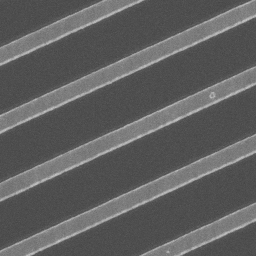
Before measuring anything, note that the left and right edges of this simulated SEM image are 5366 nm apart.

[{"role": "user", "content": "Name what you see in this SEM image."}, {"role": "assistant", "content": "lines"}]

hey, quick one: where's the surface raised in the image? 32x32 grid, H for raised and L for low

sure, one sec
LLLLLLLLLLLLHHHHHLLLLLLLLLLLLLHH
LLLLLLLLLLHHHHHLLLLLLLLLLLLLHHHH
LLLLLLLLHHHHLLLLLLLLLLLLLLHHHHHL
LLLLLHHHHHLLLLLLLLLLLLLLHHHHHLLL
LLLHHHHHLLLLLLLLLLLLLLHHHHHLLLLL
LHHHHHLLLLLLLLLLLLLLHHHHLLLLLLLL
HHHHLLLLLLLLLLLLLHHHHHLLLLLLLLLL
HLLLLLLLLLLLLLLHHHHHLLLLLLLLLLLL
LLLLLLLLLLLLLHHHHHLLLLLLLLLLLLLL
LLLLLLLLLLLHHHHHLLLLLLLLLLLLLHHH
LLLLLLLLLHHHHLLLLLLLLLLLLLLHHHHH
LLLLLLHHHHHLLLLLLLLLLLLLLHHHHHLL
LLLLHHHHHLLLLLLLLLLLLLLHHHHHLLLL
LLHHHHHLLLLLLLLLLLLLLHHHHLLLLLLL
HHHHHLLLLLLLLLLLLLHHHHHLLLLLLLLL
HHLLLLLLLLLLLLLLHHHHHLLLLLLLLLLL
LLLLLLLLLLLLLLHHHHHLLLLLLLLLLLLL
LLLLLLLLLLLLHHHHHLLLLLLLLLLLLLHH
LLLLLLLLLLHHHHHLLLLLLLLLLLLLHHHH
LLLLLLLHHHHHLLLLLLLLLLLLLLHHHHHL
LLLLLHHHHHLLLLLLLLLLLLLLHHHHHLLL
LLLHHHHHLLLLLLLLLLLLLLHHHHLLLLLL
LHHHHHLLLLLLLLLLLLLHHHHHLLLLLLLL
HHHHLLLLLLLLLLLLLHHHHHLLLLLLLLLL
HLLLLLLLLLLLLLLHHHHHLLLLLLLLLLLL
LLLLLLLLLLLLLHHHHHLLLLLLLLLLLLLL
LLLLLLLLLLLHHHHHLLLLLLLLLLLLLHHH
LLLLLLLLHHHHHLLLLLLLLLLLLLLHHHHH
LLLLLLHHHHHLLLLLLLLLLLLLLHHHHHLL
LLLLHHHHHLLLLLLLLLLLLLLHHHHHLLLL
LLHHHHHLLLLLLLLLLLLLLHHHHLLLLLLL
HHHHHLLLLLLLLLLLLLLHHHHLLLLLLLLL